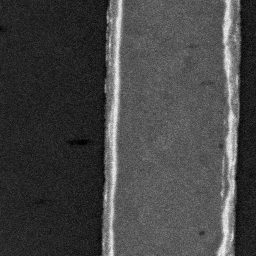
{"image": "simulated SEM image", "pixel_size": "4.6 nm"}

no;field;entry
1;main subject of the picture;one or a few lines or trenches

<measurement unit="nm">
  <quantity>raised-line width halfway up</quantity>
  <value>527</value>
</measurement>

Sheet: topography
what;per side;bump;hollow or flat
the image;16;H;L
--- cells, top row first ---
LLLLLLLLHHHHHHLL
LLLLLLLHHHHHHHLL
LLLLLLLHHHHHHHLL
LLLLLLLHHHHHHHLL
LLLLLLLHHHHHHHLL
LLLLLLLHHHHHHHLL
LLLLLLLHHHHHHHLL
LLLLLLLHHHHHHHLL
LLLLLLLHHHHHHHLL
LLLLLLLHHHHHHHLL
LLLLLLLHHHHHHHLL
LLLLLLLHHHHHHHLL
LLLLLLLHHHHHHHLL
LLLLLLLHHHHHHHLL
LLLLLLLHHHHHHHLL
LLLLLLLHHHHHHHLL